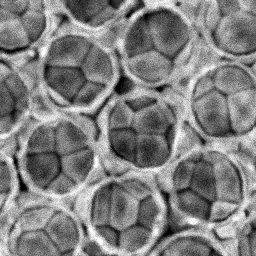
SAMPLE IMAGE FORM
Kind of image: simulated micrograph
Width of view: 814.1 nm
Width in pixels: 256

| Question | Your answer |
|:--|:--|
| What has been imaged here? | holes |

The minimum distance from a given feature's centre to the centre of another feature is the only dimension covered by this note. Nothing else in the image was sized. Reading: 264 nm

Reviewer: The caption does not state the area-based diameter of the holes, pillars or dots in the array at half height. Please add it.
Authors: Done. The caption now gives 0.215 um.